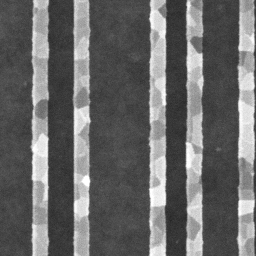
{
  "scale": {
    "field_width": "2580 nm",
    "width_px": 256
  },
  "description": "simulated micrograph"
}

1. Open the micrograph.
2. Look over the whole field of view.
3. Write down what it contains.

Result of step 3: lines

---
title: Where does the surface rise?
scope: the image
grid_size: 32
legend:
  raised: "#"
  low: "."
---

....##...##........##..##.....##
....##...##........##..##.....##
....##...##........##..##.....##
....##...##........##..##.....##
....##...##........##..##.....##
....##...##........##..##.....##
....##...##........##..##.....##
....##...##........##..##.....##
....##...##........##..##.....##
....##...##........##..##.....##
....##...##........##..##.....##
....##...##........##..##.....##
....##...##........##..##.....##
....##...##........##..##.....##
....##...##........##..##.....##
....##...##........##..##.....##
....##...##........##..##.....##
....##...##........##..##.....##
....##...##........##..##.....##
....##...##........##..##.....##
....##...##........##..##.....##
....##...##........##..##.....##
....##...##........##..##.....##
....##...##........##..##.....##
....##...##........##..##.....##
....##...##........##..##.....##
....##...##........##..##.....##
....##...##........##..##.....##
....##...##........##..##.....##
....##...##........##..##.....##
....##...##........##..##.....##
....##...##........##..##.....##